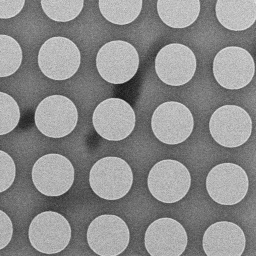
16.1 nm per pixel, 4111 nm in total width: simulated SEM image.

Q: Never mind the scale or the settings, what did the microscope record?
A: an array of small figures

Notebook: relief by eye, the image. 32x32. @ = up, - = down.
@@@--@@@@@--@@@@@@--@@@@@--@@@@@
@@----@@@@---@@@@---@@@@@--@@@@@
-------@@-----@@@---@@@@---@@@@@
----------------------------@@@-
@-------------------------------
@@---@@@@----@@@----------------
@@@--@@@@@--@@@@@---@@@@---@@@@-
@@@--@@@@@--@@@@@--@@@@@---@@@@@
@@---@@@@@--@@@@@--@@@@@---@@@@@
@-----@@@----@@@@---@@@@---@@@@@
---------------------@@-----@@@-
--------------------------------
@@---@@@@----@@-----------------
@@---@@@@---@@@@----@@@----@@@--
@@--@@@@@@--@@@@@--@@@@@--@@@@@-
@@---@@@@@--@@@@@--@@@@@--@@@@@-
@----@@@@---@@@@---@@@@@--@@@@@-
--------------@-----@@@----@@@@-
--------------------------------
@-----@@------------------------
@@--@@@@@---@@@@----@@@-----@---
@@--@@@@@--@@@@@---@@@@@--@@@@@-
@@--@@@@@--@@@@@@-@@@@@@--@@@@@-
@----@@@@---@@@@---@@@@@--@@@@@-
------------@@@----@@@@---@@@@@-
----------------------------@---
--------------------------------
@---@@@@----@@@-----@@----------
@@--@@@@@--@@@@@---@@@@---@@@@--
@---@@@@@--@@@@@--@@@@@--@@@@@@-
@---@@@@---@@@@@--@@@@@--@@@@@@-
-----@@-----@@@----@@@@---@@@@--